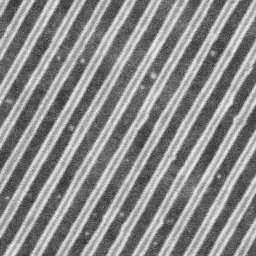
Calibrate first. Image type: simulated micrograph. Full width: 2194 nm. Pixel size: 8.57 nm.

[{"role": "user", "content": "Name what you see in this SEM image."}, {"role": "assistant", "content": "parallel lines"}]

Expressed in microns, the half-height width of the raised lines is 0.0603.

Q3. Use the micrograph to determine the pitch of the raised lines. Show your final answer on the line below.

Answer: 22.1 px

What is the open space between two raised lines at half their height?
128 nm